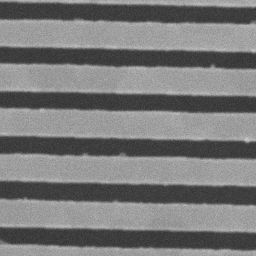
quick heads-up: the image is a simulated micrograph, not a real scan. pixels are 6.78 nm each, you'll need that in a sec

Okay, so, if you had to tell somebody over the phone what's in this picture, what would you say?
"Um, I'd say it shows lines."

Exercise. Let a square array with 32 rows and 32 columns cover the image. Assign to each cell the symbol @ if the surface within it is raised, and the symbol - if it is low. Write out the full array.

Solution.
--------------------@@@@@@@@@@@@
--------------------------------
--------------------------------
@@@@@@@@@@@@@@@@@@@@@@@@@@@@@@@@
@@@@@@@@@@@@@@@@@@@@@@@@@@@@@@@@
@@@@@@@@@@@@@@@@@@@@@@@@@@@@@@@@
-------------------------------@
--------------------------------
@@@@@@@@@@@@@@@@@@@@@@@@@@------
@@@@@@@@@@@@@@@@@@@@@@@@@@@@@@@@
@@@@@@@@@@@@@@@@@@@@@@@@@@@@@@@@
------------@@@@@@@@@@@@@@@@@@@@
--------------------------------
--------------------------------
@@@@@@@@@@@@@@@@@@@@@@@@@@@@@@@@
@@@@@@@@@@@@@@@@@@@@@@@@@@@@@@@@
@@@@@@@@@@@@@@@@@@@@@@@@@@@@@@@@
----------------------------@@@@
--------------------------------
@@@@@@@@@@----------------------
@@@@@@@@@@@@@@@@@@@@@@@@@@@@@@@@
@@@@@@@@@@@@@@@@@@@@@@@@@@@@@@@@
@@@@@@@@@@@@@@@@@@@@@@@@@@@@@@@@
--------------------------------
--------------------------------
@@@@@@@@@@@@@@@@@@@-------------
@@@@@@@@@@@@@@@@@@@@@@@@@@@@@@@@
@@@@@@@@@@@@@@@@@@@@@@@@@@@@@@@@
--------------@@@@@@@@@@@@@@@@@@
--------------------------------
--------------------------------
@@@@@@@@@@@@@@@@@@@@@@@@@@@@@@@@